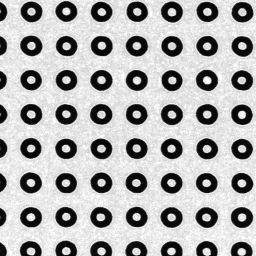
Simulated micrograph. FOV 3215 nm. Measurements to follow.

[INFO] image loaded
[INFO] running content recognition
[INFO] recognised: a regular array of ring-shaped grooves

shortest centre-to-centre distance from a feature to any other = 0.429 micrometres